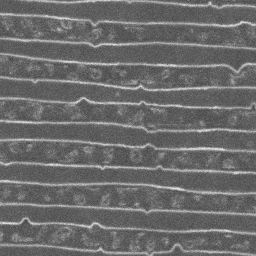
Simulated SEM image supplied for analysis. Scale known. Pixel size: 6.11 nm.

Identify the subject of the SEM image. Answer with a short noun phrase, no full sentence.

parallel lines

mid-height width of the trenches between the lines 129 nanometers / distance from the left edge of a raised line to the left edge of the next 252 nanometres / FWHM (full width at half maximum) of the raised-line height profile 123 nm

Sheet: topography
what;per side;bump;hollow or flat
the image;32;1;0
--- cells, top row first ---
11111111111111111111111000000000
11111111111111111111111111111111
00000000001111111111111111111111
00000000000000000000000000000000
00000000000000000000000000000000
11111111111001001111110000000000
11111111111111111111111111111111
00000011111111111111111111111111
00000000000000000000000000000100
00000000000000000000000000000000
11111111111110000000000000000000
11111111111111111111111111111111
00001111110111111111111111111111
00000000000000000000000000000010
00000000000000000000000000000000
11111111111111100000000000000000
11111111111111111111111111111111
10000111111111111111111111111111
00000000000000000001111111111111
00000000000000000000000000000000
11111100000000000000000000000000
11111111111111111111111111110000
11111111111111111111111111111111
00000000000000000000011111111111
00000000000000000000000000000000
01000000000000000000000000000000
11111111111111111111111111000000
11111111111111111111111111111111
00000000000001111111111111111111
00000000000000000000000000000000
00000000000000000000000000000000
11111111111110000000011111110000